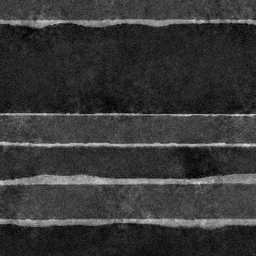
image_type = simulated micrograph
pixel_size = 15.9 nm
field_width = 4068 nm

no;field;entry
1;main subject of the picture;lines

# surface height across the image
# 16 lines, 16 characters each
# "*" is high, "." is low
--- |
****************
................
................
................
................
................
................
****************
****************
****************
****************
****************
****************
****************
................
................